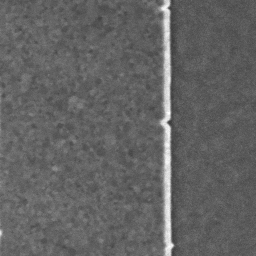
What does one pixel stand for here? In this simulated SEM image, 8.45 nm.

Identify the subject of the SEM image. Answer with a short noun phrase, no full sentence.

one or a few lines or trenches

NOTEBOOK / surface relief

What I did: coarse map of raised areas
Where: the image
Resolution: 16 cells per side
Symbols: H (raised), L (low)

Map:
HHHHHHHHHHLLLLLL
HHHHHHHHHHLLLLLL
HHHHHHHHHHLLLLLL
HHHHHHHHHHLLLLLL
HHHHHHHHHHLLLLLL
HHHHHHHHHHLLLLLL
HHHHHHHHHHLLLLLL
HHHHHHHHHHLLLLLL
HHHHHHHHHHLLLLLL
HHHHHHHHHHLLLLLL
HHHHHHHHHHLLLLLL
HHHHHHHHHHLLLLLL
HHHHHHHHHHLLLLLL
HHHHHHHHHHLLLLLL
HHHHHHHHHHLLLLLL
HHHHHHHHHHHLLLLL